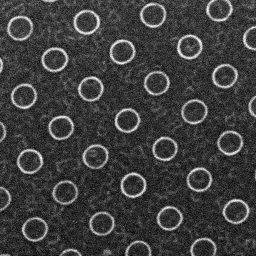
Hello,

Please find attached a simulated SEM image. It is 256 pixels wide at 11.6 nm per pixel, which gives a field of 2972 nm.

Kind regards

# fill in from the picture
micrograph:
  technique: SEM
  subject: a regular array of raised bodies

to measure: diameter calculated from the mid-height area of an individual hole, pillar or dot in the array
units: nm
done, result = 272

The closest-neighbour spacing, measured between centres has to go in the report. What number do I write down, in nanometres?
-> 542